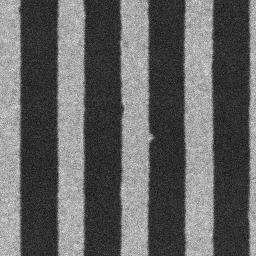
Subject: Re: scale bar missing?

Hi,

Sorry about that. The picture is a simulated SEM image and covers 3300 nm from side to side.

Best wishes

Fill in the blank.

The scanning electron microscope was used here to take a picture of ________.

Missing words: one or a few lines or trenches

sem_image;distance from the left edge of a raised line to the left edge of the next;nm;825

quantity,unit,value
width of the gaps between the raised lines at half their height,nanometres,490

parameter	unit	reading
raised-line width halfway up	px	26.4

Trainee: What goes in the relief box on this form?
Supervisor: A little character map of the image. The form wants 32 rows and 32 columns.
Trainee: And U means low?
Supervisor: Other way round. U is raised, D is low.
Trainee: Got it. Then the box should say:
UUDDDDDUUUDDDDDUUUDDDDDUUUUDDDDU
UUDDDDDUUUUDDDDUUUDDDDDUUUDDDDDU
UUDDDDDUUUUDDDDUUUUDDDDUUUDDDDDU
UUDDDDDUUUUDDDDUUUDDDDDUUUDDDDDU
UUDDDDDUUUDDDDDUUUUDDDDUUUDDDDDU
UUDDDDDUUUDDDDDUUUDDDDDUUUDDDDDU
UUDDDDDUUUDDDDDUUUDDDDDUUUDDDDDU
UUDDDDDUUUDDDDDUUUDDDDDUUUDDDDDU
UUDDDDDUUUDDDDDUUUDDDDDUUUDDDDDU
UUDDDDDUUUDDDDDUUUUDDDDUUUDDDDDU
UUDDDDDUUUDDDDDUUUUDDDDUUUDDDDDU
UUDDDDDUUUDDDDDUUUUDDDDUUUDDDDDU
UUDDDDDUUUDDDDDUUUUDDDDUUUDDDDDU
UUDDDDDUUUUDDDDDUUDDDDDUUUDDDDDU
UUDDDDDUUUDDDDDUUUUDDDDUUUDDDDDU
UUDDDDDUUUDDDDDUUUUDDDDUUUDDDDDU
UUDDDDDUUUDDDDDUUUUDDDDUUUUDDDDU
UUDDDDDUUUDDDDDUUUUDDDDUUUUDDDDU
UUDDDDDUUUDDDDDUUUUDDDDUUUDDDDDU
UUDDDDDUUUDDDDDUUUUDDDDUUUUDDDDU
UUDDDDDUUUDDDDDUUUUDDDDUUUUDDDDU
UUDDDDDUUUDDDDDUUUUDDDDUUUUDDDDU
UUDDDDDUUUDDDDDUUUUDDDDUUUUDDDDU
UUDDDDDUUUDDDDDUUUDDDDDUUUUDDDDU
UUDDDDDUUUDDDDDUUUDDDDDUUUUDDDDU
UUDDDDDUUUDDDDDUUUDDDDDUUUUDDDDU
UUDDDDDUUUDDDDDUUUDDDDDUUUUDDDDU
UUDDDDDUUUDDDDDUUUDDDDDUUUUDDDDU
UUDDDDDUUUDDDDDUUUDDDDDUUUUDDDDU
UUDDDDDUUUDDDDDUUUDDDDDUUUDDDDDU
UUDDDDDUUUDDDDDUUUDDDDDUUUUDDDDU
UUDDDDDUUUDDDDDUUUDDDDDUUUUDDDDU